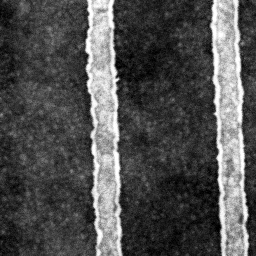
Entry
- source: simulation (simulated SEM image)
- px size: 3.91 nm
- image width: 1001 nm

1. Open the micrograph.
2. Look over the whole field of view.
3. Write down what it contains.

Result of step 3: one or a few lines or trenches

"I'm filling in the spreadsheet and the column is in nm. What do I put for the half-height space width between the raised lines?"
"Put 404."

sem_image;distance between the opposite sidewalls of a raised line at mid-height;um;0.0895